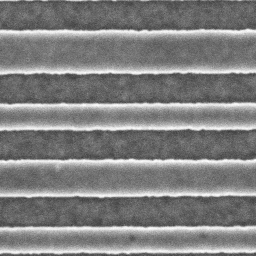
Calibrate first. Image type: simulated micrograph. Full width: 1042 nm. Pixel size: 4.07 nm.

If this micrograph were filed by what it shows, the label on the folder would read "lines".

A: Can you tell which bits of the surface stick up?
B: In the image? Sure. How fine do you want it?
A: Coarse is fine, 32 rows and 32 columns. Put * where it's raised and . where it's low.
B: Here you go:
................................
................................
................................
................................
********************************
********************************
********************************
********************************
********************************
................................
................................
................................
................................
********************************
********************************
********************************
................................
................................
................................
................................
********************************
********************************
********************************
********************************
.*.*........**..................
................................
................................
................................
*..*****************************
********************************
********************************
********************************